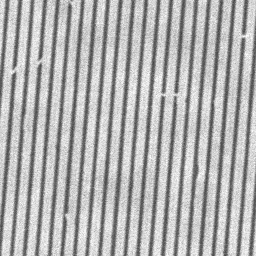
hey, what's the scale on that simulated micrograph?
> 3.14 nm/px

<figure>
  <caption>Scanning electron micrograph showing parallel lines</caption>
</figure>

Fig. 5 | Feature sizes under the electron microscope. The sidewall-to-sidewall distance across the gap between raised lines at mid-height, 12.1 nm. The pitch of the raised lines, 39.4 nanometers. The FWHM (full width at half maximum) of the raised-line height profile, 27.4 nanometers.